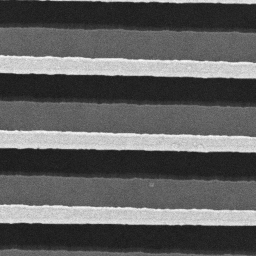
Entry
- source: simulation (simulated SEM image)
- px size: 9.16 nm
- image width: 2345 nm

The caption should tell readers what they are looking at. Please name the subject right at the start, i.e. lines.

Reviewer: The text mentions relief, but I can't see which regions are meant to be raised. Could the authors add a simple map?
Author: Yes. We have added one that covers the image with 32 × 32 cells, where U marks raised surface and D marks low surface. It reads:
DDDDDDDDDDDDDDDDDDDDDDDDDDDDDDDD
DDDDDDDDDDDDDDDDDDDDDDDDDDDDDDDD
DDDDDDDDDDDDDDDDDDDDDDDDDDDDDDDD
DUUDUUDDDDDDDDDDDDDDDDDDDDDDDDDD
UUUUUUUUUUUUUUUUUUUUUUUUUUUUUUUU
UUUUUUUUUUUUUUUUUUUUUUUUUUUUUUUU
UUUUUUUUUUUUUUUUUUUUUUUUUUUUUUUU
UUUUUUUUUUUUUUUUUUUUUUUUUUUUUUUU
UUUUUUUUUUUUUUUUUUUUUUUUUUUUUUUU
DDDDDDDDDDDDDDDDDDDUUUUUUUUUUUUU
DDDDDDDDDDDDDDDDDDDDDDDDDDDDDDDD
DDDDDDDDDDDDDDDDDDDDDDDDDDDDDDDD
DDDDDDDDDDDDDDDDDDDDDDDDDDDDDDDD
UUUUUUUUUUUUUUUUUUUUUUUUUUUUUUUU
UUUUUUUUUUUUUUUUUUUUUUUUUUUUUUUU
UUUUUUUUUUUUUUUUUUUUUUUUUUUUUUUU
UUUUUUUUUUUUUUUUUUUUUUUUUUUUUUUU
UUUUUUUUUUUUUUUUUUUUUUUUUUUUUUUU
UDUUUUUUUUUUUUUUUUUUUUUUUUUUUUUU
DDDDDDDDDDDDDDDDDDDDDDDDDDDDDDDD
DDDDDDDDDDDDDDDDDDDDDDDDDDDDDDDD
DDDDDDDDDDDDDDDDDDDDDDDDDDDDDDDD
UUUUUUUUUUUUUUUUUUUUUUUUUUUUDDDD
UUUUUUUUUUUUUUUUUUUUUUUUUUUUUUUU
UUUUUUUUUUUUUUUUUUUUUUUUUUUUUUUU
UUUUUUUUUUUUUUUUUUUUUUUUUUUUUUUU
UUUUUUUUUUUUUUUUUUUUUUUUUUUUUUUU
UUUUUUUUUUUUUUUUUUUUUUUUUUUUUUUU
DDDDDDDDDDDDDDDDDDDDDDDDDDDDDDDD
DDDDDDDDDDDDDDDDDDDDDDDDDDDDDDDD
DDDDDDDDDDDDDDDDDDDDDDDDDDDDDDDD
UUUUUUUUUUUUUDDDDDDDDDDDDDDDDDDD